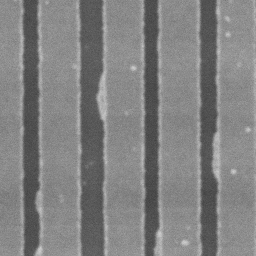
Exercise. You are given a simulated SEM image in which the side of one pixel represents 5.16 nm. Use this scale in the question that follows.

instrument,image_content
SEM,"lines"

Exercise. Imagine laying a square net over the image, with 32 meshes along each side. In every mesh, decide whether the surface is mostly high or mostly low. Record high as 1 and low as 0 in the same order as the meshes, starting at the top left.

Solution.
11100111110001111100111110011111
11100111110001111100111110011111
11100111110001111100111110011111
11100111110001111100111110011111
11100111110001111100111110011111
11100111110001111100111110011111
11100111110001111100111110011111
11100111110001111100111110011111
11100111110001111100111110011111
11100111110001111100111110011111
11100111110001111100111110011111
11100111110001111100111110011111
11100111110011111100111110011111
11100111110001111100111110011111
11100111110001111100111110011111
11100111110001111100111110011111
11100111110001111100111110011111
11100111110001111100111110011111
11100111110001111100111110011111
11100111110001111100111110011111
11100111110001111100111110011111
11100111110001111100111110011111
11100111110001111100111110011111
11100111110001111100111110011111
11100111110001111100111110011111
11100111110001111100111110011111
11100111110001111100111110011111
11100111110001111100111110011111
11100111110001111100111110011111
11100111110001111100111110011111
11100111110001111100111110011111
11100111110001111100111110011111